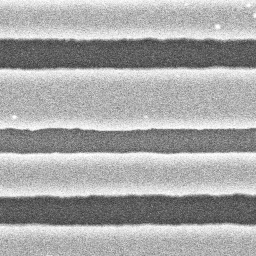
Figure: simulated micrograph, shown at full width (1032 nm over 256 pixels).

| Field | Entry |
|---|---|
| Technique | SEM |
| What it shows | lines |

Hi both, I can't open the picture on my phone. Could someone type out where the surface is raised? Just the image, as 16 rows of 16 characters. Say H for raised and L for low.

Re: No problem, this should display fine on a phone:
HHHHHHHHHHHHHHHH
HHHHHHHHHHHHHHHH
LLLLLLLLLLLLLLLL
LLLLLLLLLLLLLLLL
HHHHHHHHHHHHHHHH
HHHHHHHHHHHHHHHH
HHHHHHHHHHHHHHHH
HHHHHHHHHHHHHHHH
HHHHHHHHHHHHHHHH
HHHHHHHHHHHHHHHH
HHHHHHHHHHHHHHHH
HHHHHHHHHHHHHHHH
LLLLLLLLLLLLLLLL
LLLLLLLLLLLLLLLL
HHHHHHHHHHHHHHHH
HHHHHHHHHHHHHHHH